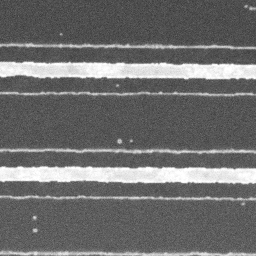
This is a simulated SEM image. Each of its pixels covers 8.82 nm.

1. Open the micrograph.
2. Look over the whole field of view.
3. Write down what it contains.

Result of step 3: lines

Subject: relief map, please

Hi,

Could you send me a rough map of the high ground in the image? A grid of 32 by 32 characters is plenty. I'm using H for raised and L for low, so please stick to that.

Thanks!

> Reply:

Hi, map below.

HHHHHHHHHHHHHHHHHHHHHHHHHHHHHHHH
HHHHHHHHHHHHHHHHHHHHHHHHHHHHHHHH
HHHHHHHHHHHHHHHHHHHHHHHHHHHHHHHH
HHHHHHHHHHHHHHHHHHHHHHHHHHHHHHHH
HHHHHHHHHHHHHHHHHHHHHHHHHHHHHHHH
HHHHHHHHHHHHHHHHHHHHHHHHHHHHHHHH
LLLLLLLLLLLLLLLLLLLLLLLLLLLLLLLL
LLLLLLLLLLLLLLLLLLLLLLLLLLLLLLLL
HHHHHHHHHHHHHHHHHHHHHHHHHHHHHHHH
HLLLHHHHHHHHHHHHHHHHHHHHHHHHHHHH
LLLLLLLLLLLLLLLLLLLLLLLLLLLLLLLL
LLLLLLLLLLLLLLLLLLLLLLLLLLLLLLLL
HHHHHHHHHHHHHHHHHHHHHHHHHHHHHHHH
HHHHHHHHHHHHHHHHHHHHHHHHHHHHHHHH
HHHHHHHHHHHHHHHHHHHHHHHHHHHHHHHH
HHHHHHHHHHHHHHHHHHHHHHHHHHHHHHHH
HHHHHHHHHHHHHHHHHHHHHHHHHHHHHHHH
HHHHHHHHHHHHHHHHHHHHHHHHHHHHHHHH
HHHHHHHHHHHHHHHHHHHHHHHHHHHHHHHH
LLLLLLLLLLLLLLLLLLLLLLLLLLLLLLLL
LLLLLLLLLLLLLLLLLLLLLLLLLLLLLLLL
HHHHHHHHHHHHHHHHHHHHHHHHHHHHHHHH
HHHHHHHHHHHHHHHHHHHHHHHHHHHHHHHH
LLLLLLLLLLLLLLLLLLLLLLLLLLLLLLLL
LLLLLLLLLLLLLLLLLLLLLLLLLLLLLLLL
HHHHHHHHHHHHHHHHHHHHHHHHHHHHHHHH
HHHHHHHHHHHHHHHHHHHHHHHHHHHHHHHH
HHHHHHHHHHHHHHHHHHHHHHHHHHHHHHHH
HHHHHHHHHHHHHHHHHHHHHHHHHHHHHHHH
HHHHHHHHHHHHHHHHHHHHHHHHHHHHHHHH
HHHHHHHHHHHHHHHHHHHHHHHHHHHHHHHH
HHHHHHHHHHHHHHHHHHHHHHHHHHHHHHHH